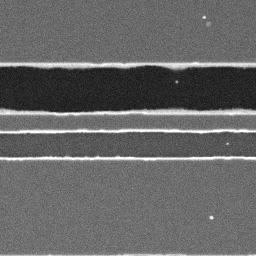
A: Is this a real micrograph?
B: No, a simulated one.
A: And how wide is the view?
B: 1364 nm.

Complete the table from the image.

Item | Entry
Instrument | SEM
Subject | lines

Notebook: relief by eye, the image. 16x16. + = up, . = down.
++++++++++++++++
++++++++++++++++
++++++++++++++++
++++++++++++++++
................
................
................
++++++++++++++++
++++++++++++++++
++++++++++++++++
++++++++++++++++
++++++++++++++++
++++++++++++++++
++++++++++++++++
++++++++++++++++
++++++++++++++++